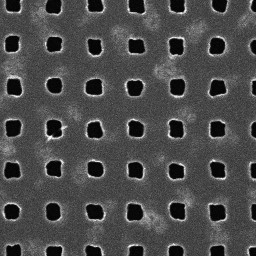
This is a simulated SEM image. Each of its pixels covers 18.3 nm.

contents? a regular array of holes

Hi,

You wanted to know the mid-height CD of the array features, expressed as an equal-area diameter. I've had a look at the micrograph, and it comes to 16.5 px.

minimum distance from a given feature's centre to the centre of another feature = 737 nanometres